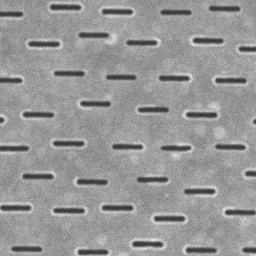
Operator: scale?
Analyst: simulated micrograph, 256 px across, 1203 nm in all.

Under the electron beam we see a regular array of holes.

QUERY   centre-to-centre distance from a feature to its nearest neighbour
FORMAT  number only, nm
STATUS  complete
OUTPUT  185